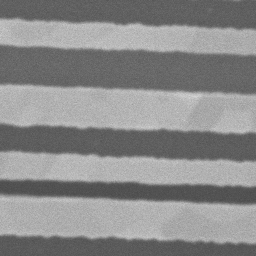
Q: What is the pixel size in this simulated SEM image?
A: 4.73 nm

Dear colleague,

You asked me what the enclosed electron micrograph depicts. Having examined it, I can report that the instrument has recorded lines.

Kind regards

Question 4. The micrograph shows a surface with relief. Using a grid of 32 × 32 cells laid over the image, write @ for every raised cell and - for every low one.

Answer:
--------------------------------
--------------------------------
@@@-----------------------------
@@@@@@@@@@@@@@@@@@@@@@@@@-------
@@@@@@@@@@@@@@@@@@@@@@@@@@@@@@@@
@@@@@@@@@@@@@@@@@@@@@@@@@@@@@@@@
------------------------@@@@@@@@
--------------------------------
--------------------------------
--------------------------------
--------------------------------
@@@@@@@@@@@@@@@@@@@@@-----------
@@@@@@@@@@@@@@@@@@@@@@@@@@@@@@@@
@@@@@@@@@@@@@@@@@@@@@@@@@@@@@@@@
@@@@@@@@@@@@@@@@@@@@@@@@@@@@@@@@
-@@@@@@@@@@@@@@@@@@@@@@@@@@@@@@@
---------------------------@@@@@
--------------------------------
--------------------------------
@@@@@@@@@@@@--------------------
@@@@@@@@@@@@@@@@@@@@@@@@@@@@@@@@
@@@@@@@@@@@@@@@@@@@@@@@@@@@@@@@@
-------@@@@@@@@@@@@@@@@@@@@@@@@@
--------------------------------
@@@@----------------------------
@@@@@@@@@@@@@@@@@@@@@@@@@@@@@---
@@@@@@@@@@@@@@@@@@@@@@@@@@@@@@@@
@@@@@@@@@@@@@@@@@@@@@@@@@@@@@@@@
@@@@@@@@@@@@@@@@@@@@@@@@@@@@@@@@
--@@@@@@@@@@@@@@@@@@@@@@@@@@@@@@
--------------------------------
--------------------------------